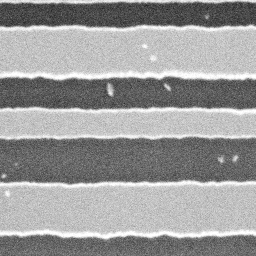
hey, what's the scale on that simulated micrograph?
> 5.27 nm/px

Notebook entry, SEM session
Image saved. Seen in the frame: lines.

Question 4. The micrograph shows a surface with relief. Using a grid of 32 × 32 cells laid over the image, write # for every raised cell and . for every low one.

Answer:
................................
................................
................................
###########.....##########.#####
################################
################################
################################
################################
################################
#####################.##########
................................
................................
................................
................................
################################
################################
################################
................................
................................
................................
................................
................................
................................
################################
################################
################################
################################
################################
################################
.......####.##....##..###.......
................................
................................